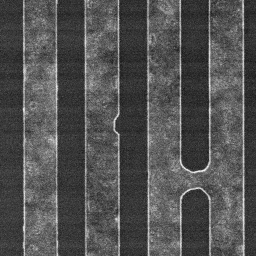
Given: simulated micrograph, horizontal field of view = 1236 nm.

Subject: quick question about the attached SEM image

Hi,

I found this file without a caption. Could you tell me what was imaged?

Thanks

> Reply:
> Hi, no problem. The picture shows one or a few lines or trenches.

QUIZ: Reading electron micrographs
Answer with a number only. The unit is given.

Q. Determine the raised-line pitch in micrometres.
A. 0.3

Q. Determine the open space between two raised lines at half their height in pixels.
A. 28.6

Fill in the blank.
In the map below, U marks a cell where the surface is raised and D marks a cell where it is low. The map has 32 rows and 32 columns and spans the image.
DDDUUUUDDDDUUUUDDDDUUUUDDDUUUUDD
DDDUUUUDDDDUUUUDDDDUUUUDDDUUUUDD
DDDUUUUDDDDUUUUDDDDUUUDDDDUUUUDD
DDDUUUUDDDDUUUUDDDDUUUDDDDUUUUDD
DDDUUUUDDDDUUUUDDDDUUUDDDDUUUUDD
DDDUUUUDDDDUUUUDDDDUUUUDDDUUUUDD
DDDUUUUDDDDUUUUDDDDUUUDDDDUUUUDD
DDDUUUUDDDDUUUUDDDDUUUDDDDUUUUDD
DDDUUUUDDDDUUUUDDDDUUUUDDDUUUUDD
DDDUUUUDDDDUUUUDDDDUUUUDDDUUUUDD
DDDUUUUDDDDUUUUDDDDUUUDDDDUUUUDD
DDDUUUUDDDDUUUUDDDDUUUDDDDUUUUDD
DDDUUUUDDDDUUUUDDDDUUUDDDDUUUUDD
DDDUUUUDDDDUUUUDDDDUUUDDDDUUUUDD
DDDUUUUDDDDUUUUDDDDUUUDDDDUUUUDD
DDDUUUUDDDDUUUDDDDDUUUDDDDUUUUDD
DDDUUUUDDDDUUUUDDDDUUUDDDDUUUUDD
DDDUUUUDDDDUUUUDDDDUUUDDDDUUUUDD
DDDUUUUDDDDUUUUDDDDUUUDDDDUUUUDD
DDDUUUUDDDDUUUUDDDDUUUDDDDUUUUDD
DDDUUUUDDDDUUUUDDDDUUUUDDDUUUUDD
DDDUUUUDDDDUUUUDDDDUUUUUUUUUUUDD
DDDUUUUDDDDUUUUDDDDUUUUUUUUUUUDD
DDDUUUUDDDDUUUUDDDDUUUUUUUUUUUDD
DDDUUUUDDDDUUUUDDDDUUUUDDDUUUUDD
DDDUUUUDDDDUUUUDDDDUUUUDDDUUUUDD
DDDUUUUDDDDUUUUDDDDUUUUDDDUUUUDD
DDDUUUUDDDDUUUUDDDDUUUUDDDUUUUDD
DDDUUUUDDDDUUUUDDDDUUUUDDDUUUUDD
DDDUUUUDDDDUUUUDDDDUUUUDDDUUUUDD
DDDUUUUDDDDUUUUDDDDUUUUDDDUUUUDD
DDDUUUUDDDDUUUUDDDDUUUUDDDUUUUDD